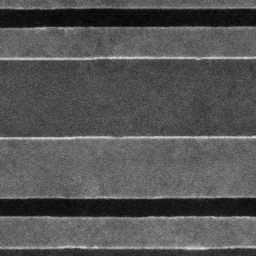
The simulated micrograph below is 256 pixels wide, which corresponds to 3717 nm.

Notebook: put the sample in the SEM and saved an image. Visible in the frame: lines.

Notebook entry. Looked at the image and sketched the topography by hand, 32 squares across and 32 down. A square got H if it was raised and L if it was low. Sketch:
HHHHHHHHHHHHHHHHHHHHHHHHHHHHHHHH
LLLLLLLLLLLLLLLLLLLLLLLLLLLLLLLL
LLLLLLLLLLLLLLLLLLLLLLLLLLLLLLLL
LLLLHHHHHHHHHHHHHHHHHHHHHHHHHHHH
HHHHHHHHHHHHHHHHHHHHHHHHHHHHHHHH
HHHHHHHHHHHHHHHHHHHHHHHHHHHHHHHH
HHHHHHHHHHHHHHHHHHHHHHHHHHHHHHHH
LLLLLLLLLLLLLLLLLLLLLLLLLLLLLLLL
LLLLLLLLLLLLLLLLLLLLLLLLLLLLLLLL
LLLLLLLLLLLLLLLLLLLLLLLLLLLLLLLL
LLLLLLLLLLLLLLLLLLLLLLLLLLLLLLLL
LLLLLLLLLLLLLLLLLLLLLLLLLLLLLLLL
LLLLLLLLLLLLLLLLLLLLLLLLLLLLLLLL
LLLLLLLLLLLLLLLLLLLLLLLLLLLLLLLL
LLLLLLLLLLLLLLLLLLLLLLLLLLLLLLLL
LLLLLLLLLLLLLLLLLLLLLLLLLLLLLLLL
LLLLLLLLLLLLLLLLLLLLLLLLLLLLLLLL
HHHHHHHHHHHHHHHHHHHHHHHHHHHHHHHH
HHHHHHHHHHHHHHHHHHHHHHHHHHHHHHHH
HHHHHHHHHHHHHHHHHHHHHHHHHHHHHHHH
HHHHHHHHHHHHHHHHHHHHHHHHHHHHHHHH
HHHHHHHHHHHHHHHHHHHHHHHHHHHHHHHH
HHHHHHHHHHHHHHHHHHHHHHHHHHHHHHHH
HHHHHHHHHHHHHHHHHHHHHHHHHHHHHHHH
HHHHHHHHHHHHHHHHHHHHHHHHHHHHHHHH
LLLLLLLLLLLLLLLLLLLLLLLLLLLLLLLL
LLLLLLLLLLLLLLLLLLLLLLLLLLLLLLLL
HHHHHHHHHHHHHHHHHHHHHHHHHHHHHHHH
HHHHHHHHHHHHHHHHHHHHHHHHHHHHHHHH
HHHHHHHHHHHHHHHHHHHHHHHHHHHHHHHH
HHHHHHHHHHHHHHHHHHHHHHHHHHHHHHHH
LLLLLLLLLLLLLLLLLLLLLLLLLLLLLLLL